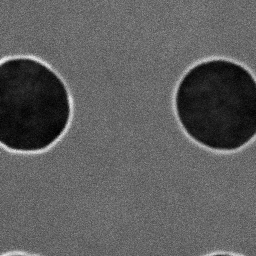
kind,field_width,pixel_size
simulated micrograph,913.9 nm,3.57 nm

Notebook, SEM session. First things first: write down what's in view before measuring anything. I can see holes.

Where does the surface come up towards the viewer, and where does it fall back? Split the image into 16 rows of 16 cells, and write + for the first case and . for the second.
++++++++++++++++
++++++++++++++++
++++++++++++++++
++++++++++++++++
...+++++++++...+
....+++++++.....
....+++++++.....
....+++++++.....
....++++++++....
++++++++++++++++
++++++++++++++++
++++++++++++++++
++++++++++++++++
++++++++++++++++
++++++++++++++++
++++++++++++++++